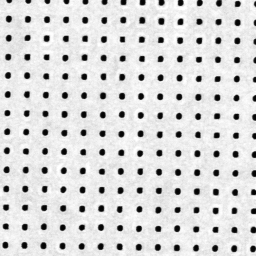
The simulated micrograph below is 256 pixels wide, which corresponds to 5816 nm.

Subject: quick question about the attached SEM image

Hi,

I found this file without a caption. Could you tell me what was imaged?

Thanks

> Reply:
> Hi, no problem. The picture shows a regular array of holes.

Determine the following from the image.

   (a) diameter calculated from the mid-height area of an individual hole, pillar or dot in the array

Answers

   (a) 160 nanometers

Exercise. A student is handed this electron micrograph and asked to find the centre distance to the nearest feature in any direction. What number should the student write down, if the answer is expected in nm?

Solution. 424